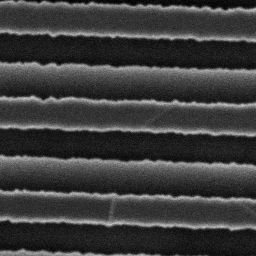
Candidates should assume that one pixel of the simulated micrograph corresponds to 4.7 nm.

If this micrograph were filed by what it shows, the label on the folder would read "lines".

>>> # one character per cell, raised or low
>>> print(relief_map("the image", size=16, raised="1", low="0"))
1111111111111000
1111111111111111
0000000000000011
0000000000000000
0000000000000000
0000000000000000
1111111111111101
1111111111111111
0000000000000000
0000000000000000
0000000000000000
0000000000000000
1111111111111111
1111111111111111
0000000000000000
0000000000000000